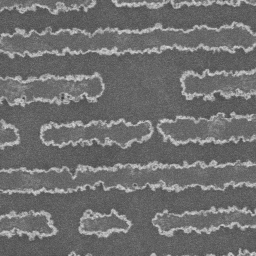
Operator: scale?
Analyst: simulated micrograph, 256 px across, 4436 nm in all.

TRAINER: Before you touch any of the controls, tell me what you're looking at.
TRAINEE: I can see parallel lines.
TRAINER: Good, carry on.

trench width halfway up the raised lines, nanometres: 407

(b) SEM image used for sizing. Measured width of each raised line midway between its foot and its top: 377 nanometers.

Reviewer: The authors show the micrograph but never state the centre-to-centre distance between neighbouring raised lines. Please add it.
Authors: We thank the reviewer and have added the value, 0.794 microns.